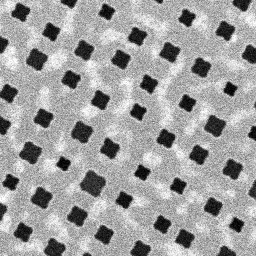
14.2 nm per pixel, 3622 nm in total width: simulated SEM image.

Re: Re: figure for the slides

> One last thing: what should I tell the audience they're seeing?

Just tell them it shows a regular array of holes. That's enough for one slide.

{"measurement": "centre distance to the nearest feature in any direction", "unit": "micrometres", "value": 0.466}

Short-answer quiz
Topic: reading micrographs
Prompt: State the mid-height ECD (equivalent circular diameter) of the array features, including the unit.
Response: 261 nm